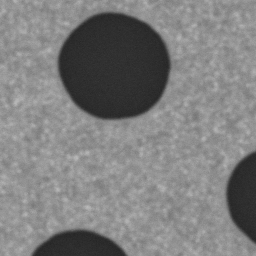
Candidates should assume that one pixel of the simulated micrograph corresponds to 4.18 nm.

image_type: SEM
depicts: holes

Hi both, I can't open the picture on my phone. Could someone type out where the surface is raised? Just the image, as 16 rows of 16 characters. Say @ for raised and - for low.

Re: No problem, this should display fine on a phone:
@@@@@@@@@@@@@@@@
@@@@@----@@@@@@@
@@@@------@@@@@@
@@@@-------@@@@@
@@@@-------@@@@@
@@@@------@@@@@@
@@@@@-----@@@@@@
@@@@@@@@@@@@@@@@
@@@@@@@@@@@@@@@@
@@@@@@@@@@@@@@@@
@@@@@@@@@@@@@@@-
@@@@@@@@@@@@@@--
@@@@@@@@@@@@@@--
@@@@@@@@@@@@@@--
@@@@--@@@@@@@@@-
@@------@@@@@@@@